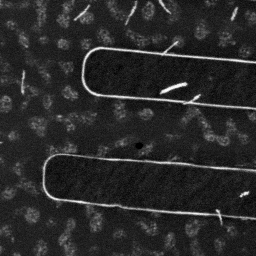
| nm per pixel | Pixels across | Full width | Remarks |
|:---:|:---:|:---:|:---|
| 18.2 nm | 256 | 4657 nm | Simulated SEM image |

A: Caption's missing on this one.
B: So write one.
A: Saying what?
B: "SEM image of one or a few lines or trenches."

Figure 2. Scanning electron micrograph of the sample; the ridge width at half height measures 0.847 um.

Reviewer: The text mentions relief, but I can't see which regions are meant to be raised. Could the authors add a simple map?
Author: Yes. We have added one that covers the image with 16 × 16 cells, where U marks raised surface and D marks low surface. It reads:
DDDDDDDDDDDDDDDD
DDDDDDDDDDDDDDDD
DDDDDDDDDDDDDDDD
DDDDDDUUUUUUDDDD
DDDDDUUUUUUUUUUU
DDDDDDUUUUUUUUUU
DDDDDDDDDDDDUUUU
DDDDDDDDDDDDDDDD
DDDDDDDDDDDDDDDD
DDDDDDDDDDDDDDDD
DDDUUUUUUUUUUDDD
DDDUUUUUUUUUUUUU
DDDDUUUUUUUUUUUU
DDDDDDDDDDDDDDUU
DDDDDDDDDDDDDDDD
DDDDDDDDDDDDDDDD